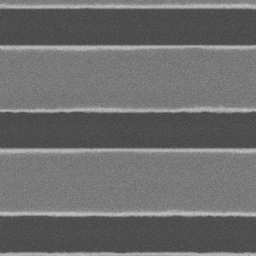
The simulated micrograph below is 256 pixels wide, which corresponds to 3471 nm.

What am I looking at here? lines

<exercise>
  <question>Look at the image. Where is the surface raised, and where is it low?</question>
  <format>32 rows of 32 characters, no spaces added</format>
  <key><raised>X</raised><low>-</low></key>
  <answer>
XXXXXXXXXXXXXXXXXXXXXXXXXXXXXXXX
--------------------------------
--------------------------------
--------------------------------
--------------------------------
--------------------------------
XXXXXXXXXXXXXXXXXXXXXXXXXXXXXXXX
XXXXXXXXXXXXXXXXXXXXXXXXXXXXXXXX
XXXXXXXXXXXXXXXXXXXXXXXXXXXXXXXX
XXXXXXXXXXXXXXXXXXXXXXXXXXXXXXXX
XXXXXXXXXXXXXXXXXXXXXXXXXXXXXXXX
XXXXXXXXXXXXXXXXXXXXXXXXXXXXXXXX
XXXXXXXXXXXXXXXXXXXXXXXXXXXXXXXX
XXXXXXXXXXXXXXXXXXXXXXXXXXXXXXXX
--------------------------------
--------------------------------
--------------------------------
--------------------------------
--------------------------------
XXXXXXXXXXXXXXXXXXXXXXXXXXXXXXXX
XXXXXXXXXXXXXXXXXXXXXXXXXXXXXXXX
XXXXXXXXXXXXXXXXXXXXXXXXXXXXXXXX
XXXXXXXXXXXXXXXXXXXXXXXXXXXXXXXX
XXXXXXXXXXXXXXXXXXXXXXXXXXXXXXXX
XXXXXXXXXXXXXXXXXXXXXXXXXXXXXXXX
XXXXXXXXXXXXXXXXXXXXXXXXXXXXXXXX
XXXXXXXXXXXXXXXXXXXXXXXXXXXXXXXX
--------------------------------
--------------------------------
--------------------------------
--------------------------------
--------------------------------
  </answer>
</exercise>